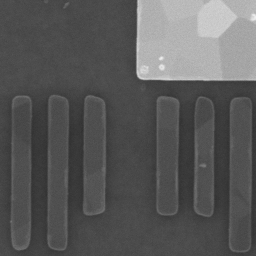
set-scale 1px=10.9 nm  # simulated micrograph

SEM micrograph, wiring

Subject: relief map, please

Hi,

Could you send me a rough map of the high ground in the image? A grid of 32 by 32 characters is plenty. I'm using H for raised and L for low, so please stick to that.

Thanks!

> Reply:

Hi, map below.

LLLLLLLLLLLLLLLLLHHHHHHHHHHHHHHH
LLLLLLLLLLLLLLLLLHHHHHHHHHHHHHHH
LLLLLLLLLLLLLLLLLHHHHHHHHHHHHHHH
LLLLLLLLLLLLLLLLLHHHHHHHHHHHHHHH
LLLLLLLLLLLLLLLLLHHHHHHHHHHHHHHH
LLLLLLLLLLLLLLLLLHHHHHHHHHHHHHHH
LLLLLLLLLLLLLLLLLHHHHHHHHHHHHHHH
LLLLLLLLLLLLLLLLLHHHHHHHHHHHHHHH
LLLLLLLLLLLLLLLLLHHHHHHHHHHHHHHH
LLLLLLLLLLLLLLLLLHHHHHHHHHHHHHHH
LLLLLLLLLLLLLLLLLLLLLLLLLLLLLLLL
LLLLLLLLLLLLLLLLLLLLLLLLLLLLLLLL
LLHHLLHHLLLHHLLLLLLLHHLLLHLLLHHL
LLHHLLHHLLLHHLLLLLLLHHLLHHHLLHHL
LLHHLLHHLLLHHLLLLLLLHHLLHHHLLHHL
LLHHLLHHLLLHHLLLLLLLHHLLHHHLLHHL
LLHHLLHHLLLHHLLLLLLLHHLLHHHLLHHL
LLHHLLHHLLLHHLLLLLLLHHLLHHHLLHHL
LLHHLLHHLLHHHLLLLLLLHHLLHHHLLHHL
LLHHLLHHLLHHHLLLLLLLHHLLHHHLLHHL
LLHHLLHHLLHHHLLLLLLLHHLLHHHLLHHL
LLHHLLHHLLHHHLLLLLLLHHLLHHHLLHHL
LLHHLLHHLLHHHLLLLLLLHHLLHHHLLHHL
LLHHLLHHLLHHHLLLLLLLHHLLHHHLLHHL
LHHHLLHHLLHHHLLLLLLLHHLLHHHLLHHL
LHHHLLHHLLHHHLLLLLLLHHLLHHHLLHHL
LHHHLLHHLLLHHLLLLLLLHHLLLHHLLHHL
LHHHLLHHLLLLLLLLLLLLLLLLLLLLLHHL
LHHHLLHHLLLLLLLLLLLLLLLLLLLLLHHL
LHHHLLHHLLLLLLLLLLLLLLLLLLLLLHHL
LLHHLLHHLLLLLLLLLLLLLLLLLLLLLHHL
LLLLLLLLLLLLLLLLLLLLLLLLLLLLLLLL